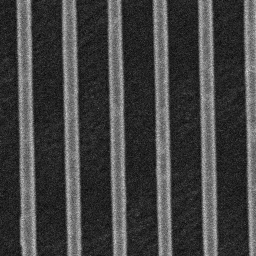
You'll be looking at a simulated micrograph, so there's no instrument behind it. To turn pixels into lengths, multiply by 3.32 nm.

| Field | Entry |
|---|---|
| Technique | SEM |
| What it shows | parallel lines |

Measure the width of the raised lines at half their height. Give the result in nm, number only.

39.9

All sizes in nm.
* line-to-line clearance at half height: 110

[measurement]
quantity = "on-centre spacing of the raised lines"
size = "151 nm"